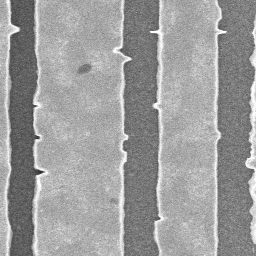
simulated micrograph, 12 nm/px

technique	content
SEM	one or a few lines or trenches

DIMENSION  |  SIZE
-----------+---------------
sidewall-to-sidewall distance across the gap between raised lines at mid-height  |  407 nm